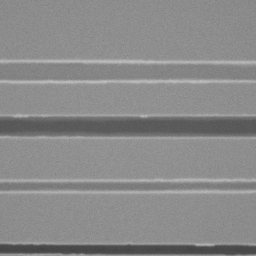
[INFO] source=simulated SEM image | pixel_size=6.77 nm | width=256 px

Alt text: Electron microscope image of lines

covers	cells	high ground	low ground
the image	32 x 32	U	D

UUUUUUUUUUUUUUUUUUUUUUUUUUUUUUUU
UUUUUUUUUUUUUUUUUUUUUUUUUUUUUUUU
UUUUUUUUUUUUUUUUUUUUUUUUUUUUUUUU
UUUUUUUUUUUUUUUUUUUUUUUUUUUUUUUU
UUUUUUUUUUUUUUUUUUUUUUUUUUUUUUUU
UUUUUUUUUUUUUUUUUUUUUUUUUUUUUUUU
UUUUUUUUUUUUUUUUUUUUUUUUUUUUUUUU
UUUUUUUUUUUUUUUUUUUUUUUUUUUUUUUU
UUUUUUUUUUUUUUUUUUUUUUUUUUUUUUUU
UUUUUUUUUUUUUUUUUUUUUUUUUUUUUUUU
UUUUUUUUUUUUUUUUUUUUUUUUUUUUUUUU
UUUUUUUUUUUUUUUUUUUUUUUUUUUUUUUU
UUUUUUUUUUUUUUUUUUUUUUUUUUUUUUUU
UUUUUUUUUUUUUUUUUUUUUUUUUUUUUUUU
DUUUDUDDDDDDDDDDDUUDDDDDDDDDDDDD
DDDDDDDDDDDDDDDDDDDDDDDDDDDDDDDD
DDDDDDDDDDDDDDDDDDDDDDDDDDDDDDDD
UUUUUUUUUUUUUUUUUUUUUUUUUUUUUUUU
UUUUUUUUUUUUUUUUUUUUUUUUUUUUUUUU
UUUUUUUUUUUUUUUUUUUUUUUUUUUUUUUU
UUUUUUUUUUUUUUUUUUUUUUUUUUUUUUUU
UUUUUUUUUUUUUUUUUUUUUUUUUUUUUUUU
UUUUUUUUUUUUUUUUUUUUUUUUUUUUUUUU
UUUUUUUUUUUUUUUUUUUUUUUUUUUUUUUU
UUUUUUUUUUUUUUUUUUUUUUUUUUUUUUUU
UUUUUUUUUUUUUUUUUUUUUUUUUUUUUUUU
UUUUUUUUUUUUUUUUUUUUUUUUUUUUUUUU
UUUUUUUUUUUUUUUUUUUUUUUUUUUUUUUU
UUUUUUUUUUUUUUUUUUUUUUUUUUUUUUUU
UUUUUUUUUUUUUUUUUUUUUUUUUUUUUUUU
UUUUUUUUUUUUUUUUUUUUUUUUUUUUUUUU
DDDDDDDDDDDDDDDDDDDDDDDDDDDDDDDD